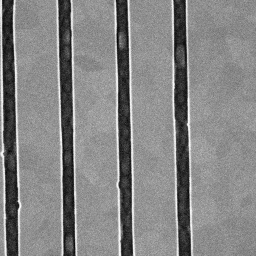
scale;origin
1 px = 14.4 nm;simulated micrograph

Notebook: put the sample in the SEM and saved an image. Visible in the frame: parallel lines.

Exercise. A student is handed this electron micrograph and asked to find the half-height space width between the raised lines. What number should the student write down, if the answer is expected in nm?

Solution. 199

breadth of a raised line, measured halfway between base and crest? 626 nm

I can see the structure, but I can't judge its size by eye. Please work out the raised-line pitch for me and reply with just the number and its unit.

823 nm